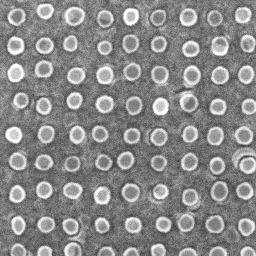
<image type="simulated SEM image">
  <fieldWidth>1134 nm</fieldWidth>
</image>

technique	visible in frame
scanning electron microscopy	a regular array of raised bodies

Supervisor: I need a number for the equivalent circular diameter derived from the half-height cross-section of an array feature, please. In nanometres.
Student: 67.1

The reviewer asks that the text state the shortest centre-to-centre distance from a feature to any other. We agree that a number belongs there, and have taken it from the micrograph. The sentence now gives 0.118 um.